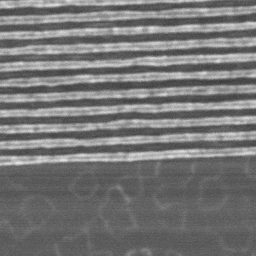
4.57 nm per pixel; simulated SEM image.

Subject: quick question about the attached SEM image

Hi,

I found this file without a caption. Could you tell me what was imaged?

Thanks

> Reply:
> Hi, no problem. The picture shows parallel lines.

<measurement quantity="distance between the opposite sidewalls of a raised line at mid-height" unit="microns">0.0268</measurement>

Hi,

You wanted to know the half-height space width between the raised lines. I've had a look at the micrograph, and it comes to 0.0445 micrometres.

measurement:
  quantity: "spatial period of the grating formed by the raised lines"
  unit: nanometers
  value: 71.4